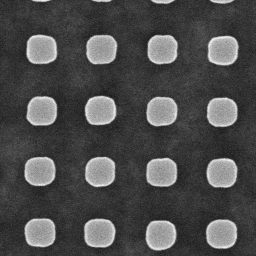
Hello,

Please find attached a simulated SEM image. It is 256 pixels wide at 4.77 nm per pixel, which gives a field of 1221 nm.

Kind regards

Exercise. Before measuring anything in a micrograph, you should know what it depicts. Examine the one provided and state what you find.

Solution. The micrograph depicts a regular array of raised bodies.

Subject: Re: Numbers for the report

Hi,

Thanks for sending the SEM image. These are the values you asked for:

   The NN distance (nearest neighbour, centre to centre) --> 287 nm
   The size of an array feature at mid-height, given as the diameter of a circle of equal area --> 144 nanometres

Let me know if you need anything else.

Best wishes